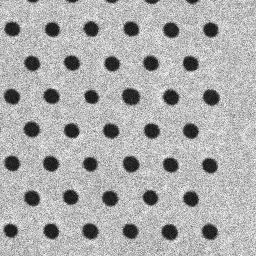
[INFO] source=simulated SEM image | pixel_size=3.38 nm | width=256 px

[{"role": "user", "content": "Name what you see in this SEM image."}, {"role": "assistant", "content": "a regular array of holes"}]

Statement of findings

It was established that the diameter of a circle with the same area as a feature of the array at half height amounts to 51 nm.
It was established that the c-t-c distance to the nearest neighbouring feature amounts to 0.131 microns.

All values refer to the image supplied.